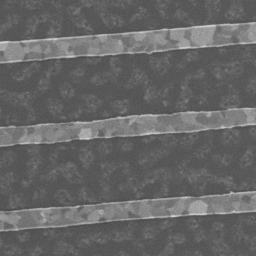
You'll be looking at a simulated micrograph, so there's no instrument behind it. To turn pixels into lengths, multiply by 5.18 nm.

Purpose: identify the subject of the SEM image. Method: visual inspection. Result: one or a few lines or trenches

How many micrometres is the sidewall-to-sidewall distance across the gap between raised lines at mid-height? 0.34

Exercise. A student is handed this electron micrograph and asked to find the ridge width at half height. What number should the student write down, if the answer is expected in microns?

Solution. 0.1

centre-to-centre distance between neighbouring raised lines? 435 nanometres